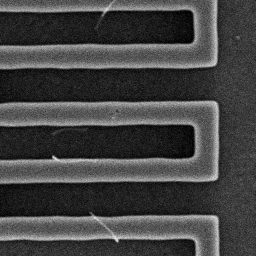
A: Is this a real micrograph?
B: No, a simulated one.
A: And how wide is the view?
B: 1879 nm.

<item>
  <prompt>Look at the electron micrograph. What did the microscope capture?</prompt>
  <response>groups of lines, slits or small figures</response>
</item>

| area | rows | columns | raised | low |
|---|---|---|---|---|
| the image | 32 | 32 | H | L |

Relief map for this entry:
HHHHHHHHHHHHHHHHHHHHHHHHHHHLLLLL
LLLLLLLLLLLLLLLLLLLLLLLLHHHLLLLL
LLLLLLLLLLLLLLLLLLLLLLLLHHHLLLLL
LLLLLLLLLLLLLLLLLLLLLLLLHHHLLLLL
LLLLLLLLLLLLLLLLLLLLLLLLHHHLLLLL
LLLLLLLLLLLLLLLLLLLLLLLLHHHLLLLL
HHHHHHHHHHHHHHHHHHHHHHHHHHHLLLLL
HHHHHHHHHHHHHHHHHHHHHHHHHHHLLLLL
HHLLLLLLLLLLLLLLLLLLLLLLLLLLLLLL
LLLLLLLLLLLLLLLLLLLLLLLLLLLLLLLL
LLLLLLLLLLLLLLLLLLLLLLLLLLLLLLLL
LLLLLLLLLLLLLLLLLLLLLLLLLLLLLLLL
LLLLLLLLLLLLLLLLLLLLLLLLLLLLLLLL
HHHHHHHHHHHHHHHHHHHHHHHHHHHLLLLL
HHHHHHHHHHHHHHHHHHHHHHHHHHHLLLLL
HHHHHHHHHHHHHHHHHLLHHLLHHHHLLLLL
LLLLLLLLLLLLLLLLLLLLLLLLHHHLLLLL
LLLLLLLLLLLLLLLLLLLLLLLLHHHLLLLL
LLLLLLLLLLLLLLLLLLLLLLLLHHHLLLLL
LLLLLLLLLLLLLLLLLLLLLLLLHHHLLLLL
HHHHHHHHHHHHHHHHHHHHHHHHHHHLLLLL
HHHHHHHHHHHHHHHHHHHHHHHHHHHLLLLL
HHHHHHHHHHHHHHHHHHHHHHHHHHHLLLLL
LLLLLLLLLLLLLLLLLLLLLLLLLLLLLLLL
LLLLLLLLLLLLLLLLLLLLLLLLLLLLLLLL
LLLLLLLLLLLLLLLLLLLLLLLLLLLLLLLL
LLLLLLLLLLLLLLLLLLLLLLLLLLLLLLLL
HHHHHHHHHHHHHHHHHHHHHHHHHHHLLLLL
HHHHHHHHHHHHHHHHHHHHHHHHHHHLLLLL
HHHHHHHHHHHHHHHHHHHHHHHHHHHLLLLL
LLLLLLLLLLLLLLLLLLLLLLLLHHHLLLLL
LLLLLLLLLLLLLLLLLLLLLLLLLHHLLLLL